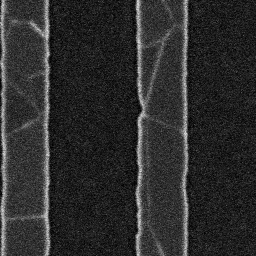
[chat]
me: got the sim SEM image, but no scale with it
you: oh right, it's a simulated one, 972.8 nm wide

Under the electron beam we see one or a few lines or trenches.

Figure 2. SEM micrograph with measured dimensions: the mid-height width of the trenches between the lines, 341 nm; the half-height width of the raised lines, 178 nm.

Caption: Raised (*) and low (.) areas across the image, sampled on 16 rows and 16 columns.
***......***....
***......***....
***......***....
***......***....
***......***....
***......***....
***......***....
***......***....
***......***....
***......***....
***......***....
***......***....
***......***....
***......***....
***......***....
***......***....